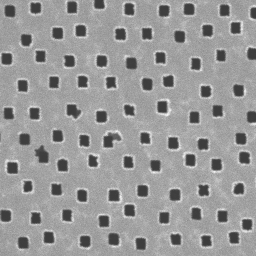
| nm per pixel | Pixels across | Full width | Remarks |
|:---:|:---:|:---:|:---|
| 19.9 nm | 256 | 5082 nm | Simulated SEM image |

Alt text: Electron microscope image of a regular array of holes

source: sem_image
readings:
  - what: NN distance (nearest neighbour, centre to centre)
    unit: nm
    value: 490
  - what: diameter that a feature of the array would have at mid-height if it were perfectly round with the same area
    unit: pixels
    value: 12.4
